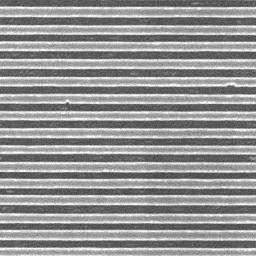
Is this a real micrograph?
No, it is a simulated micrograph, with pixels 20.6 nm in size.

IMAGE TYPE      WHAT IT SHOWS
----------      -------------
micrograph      parallel lines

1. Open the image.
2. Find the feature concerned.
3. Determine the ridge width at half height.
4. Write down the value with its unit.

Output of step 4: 191 nanometres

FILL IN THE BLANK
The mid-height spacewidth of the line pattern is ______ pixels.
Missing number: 8.5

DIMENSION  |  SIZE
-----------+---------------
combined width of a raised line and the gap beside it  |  0.354 microns